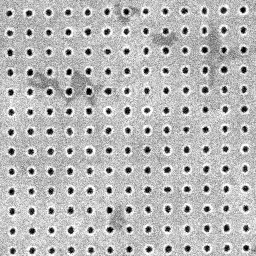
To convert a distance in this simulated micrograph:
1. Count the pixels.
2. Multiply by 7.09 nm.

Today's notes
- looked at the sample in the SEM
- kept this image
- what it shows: a regular array of holes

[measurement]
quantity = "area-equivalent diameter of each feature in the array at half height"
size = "0.0543 micrometres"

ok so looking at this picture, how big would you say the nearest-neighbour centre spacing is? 137 nm